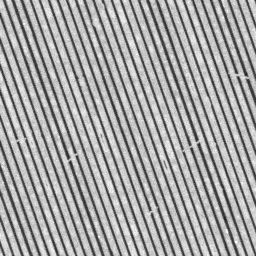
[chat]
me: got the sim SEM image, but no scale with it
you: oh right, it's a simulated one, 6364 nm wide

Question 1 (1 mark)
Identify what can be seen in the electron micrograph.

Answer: parallel lines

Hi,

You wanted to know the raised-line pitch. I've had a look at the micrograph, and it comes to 211 nm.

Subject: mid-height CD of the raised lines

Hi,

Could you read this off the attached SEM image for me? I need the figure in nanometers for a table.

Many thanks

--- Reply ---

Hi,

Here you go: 129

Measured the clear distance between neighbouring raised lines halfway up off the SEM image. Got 64.4 nm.